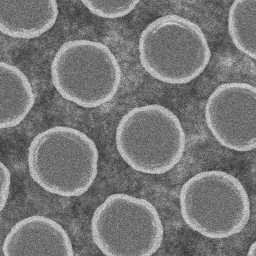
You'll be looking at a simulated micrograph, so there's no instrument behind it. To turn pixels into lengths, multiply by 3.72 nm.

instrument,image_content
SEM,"raised bodies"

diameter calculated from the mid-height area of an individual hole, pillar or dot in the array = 238 nm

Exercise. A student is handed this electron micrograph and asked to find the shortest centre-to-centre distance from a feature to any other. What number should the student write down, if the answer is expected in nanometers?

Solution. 337